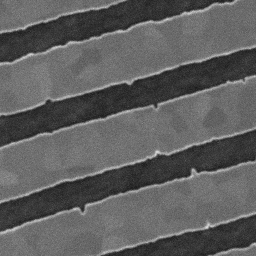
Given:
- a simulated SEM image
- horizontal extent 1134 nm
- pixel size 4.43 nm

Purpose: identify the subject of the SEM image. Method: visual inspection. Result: one or a few lines or trenches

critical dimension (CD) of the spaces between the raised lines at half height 0.123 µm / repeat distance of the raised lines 0.355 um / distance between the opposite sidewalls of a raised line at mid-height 51.7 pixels